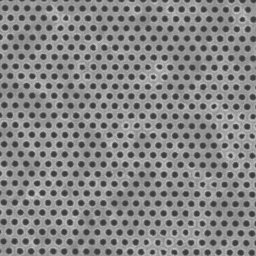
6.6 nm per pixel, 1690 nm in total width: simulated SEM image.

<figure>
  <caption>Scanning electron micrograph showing a regular array of holes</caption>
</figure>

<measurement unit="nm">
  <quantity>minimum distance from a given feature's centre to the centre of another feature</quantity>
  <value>71.3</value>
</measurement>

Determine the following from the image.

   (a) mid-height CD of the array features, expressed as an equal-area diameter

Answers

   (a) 0.0428 um